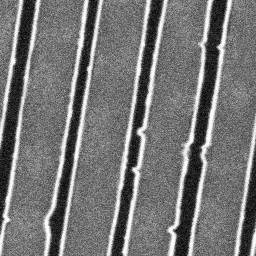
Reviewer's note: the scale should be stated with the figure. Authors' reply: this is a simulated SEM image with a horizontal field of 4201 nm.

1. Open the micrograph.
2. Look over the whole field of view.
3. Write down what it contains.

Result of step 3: one or a few lines or trenches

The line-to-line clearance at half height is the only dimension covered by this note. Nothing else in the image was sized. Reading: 774 nm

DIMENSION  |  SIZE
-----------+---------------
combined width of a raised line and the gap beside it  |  1030 nm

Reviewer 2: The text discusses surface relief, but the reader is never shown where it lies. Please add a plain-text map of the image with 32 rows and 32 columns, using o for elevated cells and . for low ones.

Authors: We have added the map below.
...oo......oo.....ooo.....ooo...
..ooo......o......oo......ooo...
..oo......oo......oo......oo....
..oo......oo......oo......oo....
..oo......oo......oo......oo....
..oo......oo......oo.....ooo....
..oo......oo......oo.....ooo....
..oo......oo.....oo......ooo....
.oo.......o......oo......ooo....
.oo......oo......oo......oo.....
.oo......oo......oo......oo.....
.oo......oo......oo......oo.....
.oo......oo......oo......oo.....
.oo......oo......o.......oo.....
ooo......o......oo......oo......
oo......oo......oo......oo......
oo......oo......oo......oo......
oo......oo......oo......oo......
oo......oo......oo.....ooo......
oo......oo......oo.....oo......o
oo......o.......o......ooo.....o
oo.....oo......oo......oo......o
oo.....oo......oo......oo......o
o......oo......oo......oo......o
o......oo......oo......oo......o
o......oo......oo.....ooo.....oo
o.....oo......oo......ooo.....oo
o.....oo......oo......oo......oo
......oo......oo......oo......oo
......oo......oo......oo......oo
......oo......oo......oo......oo
......oo......oo.....ooo......oo